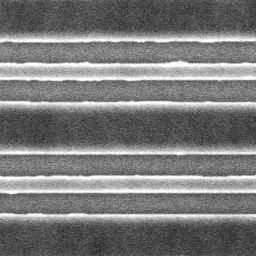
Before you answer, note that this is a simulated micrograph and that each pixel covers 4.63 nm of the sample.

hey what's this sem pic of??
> lines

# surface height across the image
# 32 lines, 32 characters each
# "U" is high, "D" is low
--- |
UUUUUUUUUUUUUUUUUUUUUUUUUUUUUUUU
UUUUUUUUUUUUUUUUUUUUUUUUUUUUUUUU
UUUUUUUUUUUUUUUUUUUUUUUUUUUUUUUU
UUUUUUUUUUUUUUUUUUUUUUUUUUUUUUUU
UUUUUUUUUUUUUUUUUUUUUUUUUUUUUUUU
DDDDDDDDDDDDDDDDDDDDDDDDDDDDDDDD
DDDDDDDDDDDDDDDDDDDDDDDDDDDDDDDD
DDDDDDDDDDDDDDDDDDDDDDDDDDDDDDDD
UUUUUUUUUUUUUUUUUUUUUUUUUUUUUUUU
UUUUUUUUUUUUUUUUUUUUUUUUUUUUUUUU
DDDDDDDDDDDDDDDDDDDDDDDDDDDDDDDD
DDDDDDDDDDDDDDDDDDDDDDDDDDDDDDDD
DDDDDDDDDDDDDDDDDDDDDDDDDDDDDDDD
UUUUUUUUUUUUUUUUUUUUUUUUUUUUUUUU
UUUUUUUUUUUUUUUUUUUUUUUUUUUUUUUU
UUUUUUUUUUUUUUUUUUUUUUUUUUUUUUUU
UUUUUUUUUUUUUUUUUUUUUUUUUUUUUUUU
UUUUUUUUUUUUUUUUUUUUUUUUUUUUUUUU
UUUUUUUUUUUUUUUUUUUUUUUUUUUUUUUU
DDDDDDDDDDDDDDDDDDDDDDDDDDDDDDDD
DDDDDDDDDDDDDDDDDDDDDDDDDDDDDDDD
DDDDDDDDDDDDDDDDDDDDDDDDDDDDDDDD
UUUUUUUUUUUUUUUUUUUUUUUUUUUUUUUU
UUUUUUUUUUUUUUUUUUUUUUUUUUUUUUUU
DDDDDDDDDDDDDDDDDDDDDDDDDDDDDDDD
DDDDDDDDDDDDDDDDDDDDDDDDDDDDDDDD
DDDDDDDDDDDDDDDDDDDDDDDDDDDDDDDD
UUUUUUUUUUUUUUUUUUUUUUUUUUUUUUUU
UUUUUUUUUUUUUUUUUUUUUUUUUUUUUUUU
UUUUUUUUUUUUUUUUUUUUUUUUUUUUUUUU
UUUUUUUUUUUUUUUUUUUUUUUUUUUUUUUU
UUUUUUUUUUUUUUUUUUUUUUUUUUUUUUUU